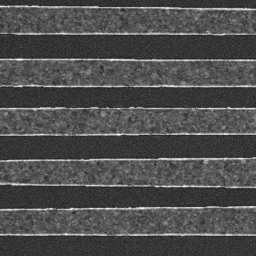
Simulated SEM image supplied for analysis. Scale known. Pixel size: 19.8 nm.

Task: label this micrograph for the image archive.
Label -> lines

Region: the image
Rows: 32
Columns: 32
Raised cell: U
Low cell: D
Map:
DDDDDDDDDDDDDDDDDDDDDDDDDDDDDDDD
UUUUUUUUUUUUUUUUUUUUUUUUUUUUUUUU
UUUUUUUUUUUUUUUUUUUUUUUUUUUUUUUU
UUUUUUUUUUUUUUUUUUUUUUUUUUUUUUUU
DDDDDDDDDDDDDDDDDDDDDDDDDDDDDDDD
DDDDDDDDDDDDDDDDDDDDDDDDDDDDDDDD
DDDDDDDDDDDDDDDDDDDDDDDDDDDDDDDD
UUUUUUUUUUUUUDDDDDDDDDDDDDDDDDDD
UUUUUUUUUUUUUUUUUUUUUUUUUUUUUUUU
UUUUUUUUUUUUUUUUUUUUUUUUUUUUUUUU
UUUUUUUUUUUUUUUUUUUUUUUUUUUUUUUU
DDDDDDDDDDDDDDDDDDDDDDDDDDDDDDDD
DDDDDDDDDDDDDDDDDDDDDDDDDDDDDDDD
DDDDDDDDDDDDDDDDDDDDDDDDDDDDDDDD
UUUUUUUUUUUUUUUUUUUUUUUUUUUUUUUU
UUUUUUUUUUUUUUUUUUUUUUUUUUUUUUUU
UUUUUUUUUUUUUUUUUUUUUUUUUUUUUUUU
DDDDDDDDDDDDDDDDDDDDDDDDDDDDDDDD
DDDDDDDDDDDDDDDDDDDDDDDDDDDDDDDD
DDDDDDDDDDDDDDDDDDDDDDDDDDDDDDDD
UUUUUUUUUUUUUUUUUUUUUUUUUUUUUUUU
UUUUUUUUUUUUUUUUUUUUUUUUUUUUUUUU
UUUUUUUUUUUUUUUUUUUUUUUUUUUUUUUU
DDDDDDDDDDDDDDDDDDDDDDDDDDDDDDDD
DDDDDDDDDDDDDDDDDDDDDDDDDDDDDDDD
DDDDDDDDDDDDDDDDDDDDDDDDDDDDDDDD
UUUUUUUUUUUUUUUUUUUUUUUUUUUUUUUU
UUUUUUUUUUUUUUUUUUUUUUUUUUUUUUUU
UUUUUUUUUUUUUUUUUUUUUUUUUUUUUUUU
DDDDDDDDDDDDDDDDDDDDDDDDDDDDDDDD
DDDDDDDDDDDDDDDDDDDDDDDDDDDDDDDD
DDDDDDDDDDDDDDDDDDDDDDDDDDDDDDDD